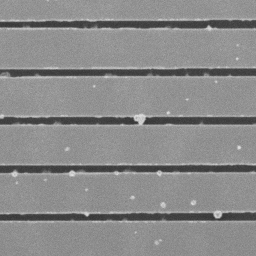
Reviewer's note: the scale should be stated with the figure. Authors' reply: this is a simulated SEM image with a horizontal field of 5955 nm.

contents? lines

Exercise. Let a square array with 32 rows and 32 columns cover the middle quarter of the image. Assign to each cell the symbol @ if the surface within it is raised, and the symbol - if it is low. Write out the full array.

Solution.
@@@@@@@@@@@@@@@@@@@@@@@@@@@@@@@@
--------------------------------
--------------------------------
@@@@@@@@@@@@@@@@@@@@@@@@@@@@@@@@
@@@@@@@@@@@@@@@@@@@@@@@@@@@@@@@@
@@@@@@@@@@@@@@@@@@@@@@@@@@@@@@@@
@@@@@@@@@@@@@@@@@@@@@@@@@@@@@@@@
@@@@@@@@@@@@@@@@@@@@@@@@@@@@@@@@
@@@@@@@@@@@@@@@@@@@@@@@@@@@@@@@@
@@@@@@@@@@@@@@@@@@@@@@@@@@@@@@@@
@@@@@@@@@@@@@@@@@@@@@@@@@@@@@@@@
@@@@@@@@@@@@@@@@@@@@@@@@@@@@@@@@
@@@@@@@@@@@@@@@@@@@@@@@@@@@@@@@@
-----------------@@@------------
------------------@@------------
@@@@@@@@@@@@@@@@@@@@@@@@@@@@@@@@
@@@@@@@@@@@@@@@@@@@@@@@@@@@@@@@@
@@@@@@@@@@@@@@@@@@@@@@@@@@@@@@@@
@@@@@@@@@@@@@@@@@@@@@@@@@@@@@@@@
@@@@@@@@@@@@@@@@@@@@@@@@@@@@@@@@
@@@@@@@@@@@@@@@@@@@@@@@@@@@@@@@@
@@@@@@@@@@@@@@@@@@@@@@@@@@@@@@@@
@@@@@@@@@@@@@@@@@@@@@@@@@@@@@@@@
@@@@@@@@@@@@@@@@@@@@@@@@@@@@@@@@
@@@@@@@@@@@@@@@@@@@@@@@@@@@@@@@@
--------------------------------
--------------------------------
@@@@@@@@@@@@@@@@@@@@@@@@@@@@@@@@
@@@@@@@@@@@@@@@@@@@@@@@@@@@@@@@@
@@@@@@@@@@@@@@@@@@@@@@@@@@@@@@@@
@@@@@@@@@@@@@@@@@@@@@@@@@@@@@@@@
@@@@@@@@@@@@@@@@@@@@@@@@@@@@@@@@